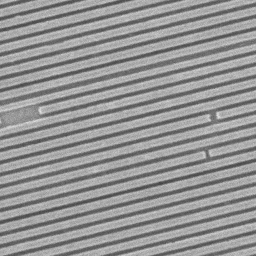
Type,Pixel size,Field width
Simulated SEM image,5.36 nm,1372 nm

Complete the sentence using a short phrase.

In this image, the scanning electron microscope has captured parallel lines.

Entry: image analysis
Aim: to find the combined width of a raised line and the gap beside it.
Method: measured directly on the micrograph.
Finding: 62.4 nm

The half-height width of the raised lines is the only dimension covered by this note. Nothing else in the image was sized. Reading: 40.9 nanometres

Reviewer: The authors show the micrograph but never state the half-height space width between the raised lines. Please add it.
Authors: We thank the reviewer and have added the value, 0.0254 um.